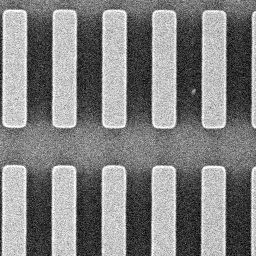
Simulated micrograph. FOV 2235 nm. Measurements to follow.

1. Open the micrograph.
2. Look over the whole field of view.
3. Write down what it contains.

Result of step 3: groups of lines, slits or small figures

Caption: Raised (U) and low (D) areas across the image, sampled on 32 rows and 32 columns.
DDDDDDDDDDDDDDDDDDDDDDDDDDDDDDDD
DUUDDDDUUDDDDUUDDDDUUUDDDDUUDDDD
UUUDDDDUUUDDDUUUDDDUUUDDDUUUDDDD
UUUDDDDUUUDDDUUUDDDUUUDDDUUUDDDD
UUUDDDDUUUDDDUUUDDDUUUDDDUUUDDDD
UUUDDDDUUUDDDUUUDDDUUUDDDUUUDDDD
UUUDDDDUUUDDDUUUDDDUUUDDDUUUDDDD
UUUDDDDUUDDDDUUUDDDUUUDDDUUUDDDD
UUUDDDDUUDDDDUUUDDDUUUDDDUUUDDDD
UUUDDDDUUDDDDUUUDDDUUUDDDUUUDDDD
UUUDDDDUUDDDDUUUDDDUUUDDDUUUDDDD
UUUDDDDUUDDDDUUUDDDUUUDDDUUUDDDD
UUUDDDDUUDDDDUUUDDDUUUDDDUUUDDDD
UUUDDDDUUDDDDUUUDDDUUUDDDUUUDDDD
UUUDDDDUUDDDDUUUDDDUUUDDDUUUDDDU
DUUDDDDUUDDDDUUUDDDUUUDDDUUUDDDD
DDDDDDDDDDDDDDDDDDDDDDDDDDDDDDDD
DDDDDDDDDDDDDDDDDDDDDDDDDDDDDDDD
DDDDDDDDDDDDDDDDDDDDDDDDDDDDDDDD
DDDDDDDDDDDDDDDDDDDDDDDDDDDDDDDD
DDDDDDDDDDDDDDDDDDDDDDDDDDDDDDDD
UUUDDDDUUDDDDUUUDDDUUUDDDUUUDDDD
UUUDDDDUUDDDDUUUDDDUUUDDDUUUDDDU
UUUDDDDUUDDDDUUUDDDUUUDDDUUUDDDU
UUUDDDDUUDDDDUUUDDDUUUDDDUUUDDDU
UUUDDDDUUDDDDUUUDDDUUUDDDUUUDDDU
UUUDDDDUUDDDDUUUDDDUUUDDDUUUDDDU
UUUDDDDUUDDDDUUUDDDUUUDDDUUUDDDU
UUUDDDDUUDDDDUUUDDDUUUDDDUUUDDDU
UUUDDDDUUDDDDUUUDDDUUUDDDUUUDDDU
UUUDDDDUUDDDDUUUDDDUUUDDDUUUDDDU
UUUDDDDUUDDDDUUUDDDUUUDDDUUUDDDU